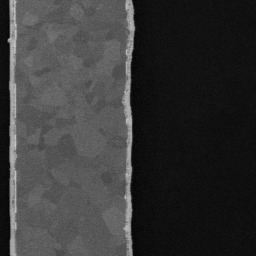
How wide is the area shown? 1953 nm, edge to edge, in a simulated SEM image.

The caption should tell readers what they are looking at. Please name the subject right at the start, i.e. one or a few lines or trenches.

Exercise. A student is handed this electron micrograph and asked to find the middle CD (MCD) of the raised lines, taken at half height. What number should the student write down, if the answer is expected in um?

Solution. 0.902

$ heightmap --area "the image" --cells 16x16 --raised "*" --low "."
.*******........
.*******........
.*******........
.*******........
.*******........
.*******........
.*******........
.*******........
.*******........
.*******........
.*******........
.*******........
.*******........
.*******........
.*******........
.*******........